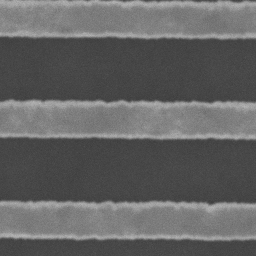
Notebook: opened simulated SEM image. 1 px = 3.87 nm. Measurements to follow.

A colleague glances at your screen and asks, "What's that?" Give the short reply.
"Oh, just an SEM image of lines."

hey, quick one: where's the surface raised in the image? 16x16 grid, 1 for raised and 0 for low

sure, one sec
1111111111111111
1111111111111111
0000000000000000
0000000000000000
0000000000000000
0000000000000000
1111111111111111
1111111111111111
1111111111111111
0000000000000000
0000000000000000
0000000000000000
0000000000000000
1111111111111111
1111111111111111
0000000000000000